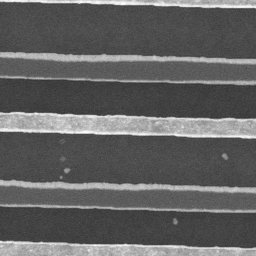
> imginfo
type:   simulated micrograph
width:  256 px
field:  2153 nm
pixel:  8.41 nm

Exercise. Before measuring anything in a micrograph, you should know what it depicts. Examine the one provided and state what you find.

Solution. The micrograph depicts lines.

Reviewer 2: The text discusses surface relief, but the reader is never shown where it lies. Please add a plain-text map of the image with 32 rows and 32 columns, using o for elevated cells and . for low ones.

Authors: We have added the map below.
..............oooooooooooooooooo
................................
................................
................................
................................
................................
................................
ooooooooooooooooooooooooooooo...
oooooooooooooooooooooooooooooooo
oooooooooooooooooooooooooooooooo
................................
................................
................................
................................
oooooooooooo..oo................
oooooooooooooooooooooooooooooooo
........oooooooooooooooooooooooo
................................
................................
................................
................................
................................
................................
ooooooooooooooooooooooooo.......
oooooooooooooooooooooooooooooooo
oooooooooooooooooooooooooooooooo
............................oooo
................................
................................
................................
oooooooo........................
oooooooooooooooooooooooooooooooo